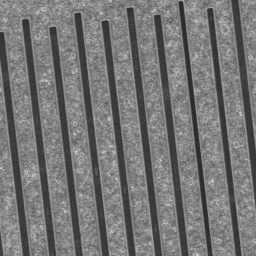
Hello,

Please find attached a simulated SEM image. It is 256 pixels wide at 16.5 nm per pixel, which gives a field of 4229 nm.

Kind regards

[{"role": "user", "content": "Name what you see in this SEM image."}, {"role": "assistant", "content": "parallel lines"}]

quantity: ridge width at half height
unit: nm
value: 316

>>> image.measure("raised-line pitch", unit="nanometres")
434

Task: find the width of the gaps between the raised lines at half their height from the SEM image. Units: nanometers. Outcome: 115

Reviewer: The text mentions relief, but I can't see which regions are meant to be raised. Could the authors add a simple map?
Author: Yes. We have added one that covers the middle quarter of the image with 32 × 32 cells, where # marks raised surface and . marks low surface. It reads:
####..#####.#####..#####..####..
####..#####..####..#####..####..
####..#####..####..#####..#####.
####..#####..####...####..#####.
####..#####..#####..####..#####.
#####.#####..#####..####..#####.
#####..####..#####..####...####.
#####..####..#####..#####..####.
#####..####..#####..#####..####.
#####..#####..####..#####..####.
#####..#####..####..#####..####.
.####..#####..####..#####..#####
.####..#####..#####.#####..#####
.####..#####..#####..####..#####
.#####..####..#####..####..#####
.#####..####..#####..####...####
.#####..####..#####..#####..####
.#####..#####.#####..#####..####
.#####..#####..####..#####..####
..####..#####..####..#####..####
..####..#####..####..#####..####
..####..#####..#####.#####..####
..#####.#####..#####..####..####
..#####..####..#####..####...###
..#####..####..#####..#####..###
..#####..####..#####..#####..###
..#####..#####..####..#####..###
#.#####..#####..####..#####..###
#..####..#####..####..#####..###
#..####..#####..#####.#####..###
#..####..#####..#####..####..###
#..#####..####..#####..####..###